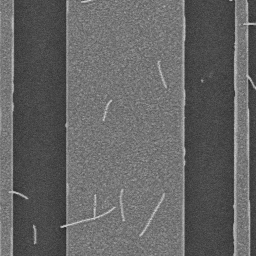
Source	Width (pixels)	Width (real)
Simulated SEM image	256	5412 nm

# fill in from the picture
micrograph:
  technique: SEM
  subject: lines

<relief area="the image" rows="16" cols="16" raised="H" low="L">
HLLLHHHHHHHLLLLL
HLLLHHHHHHHHLLLH
HLLLHHHHHHHHLLLL
HLLLHHHHHHHLLLLL
HLLLHHHHHHHLLLLH
HLLLHHHHHHHHLLLH
HLLLHHHHHHHHLLLL
HLLLHHHHHHHLLLLH
HLLLHHHHHHHLLLLH
HLLLHHHHHHHHLLLH
HLLLHHHHHHHLLLLH
HLLLHHHHHHHLLLLH
HLLLHHHHHHHLLLLH
HLLLHHHHHHHLLLLH
HLLLHHHHHHHLLLLH
HLLLHHHHHHHLLLLH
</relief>